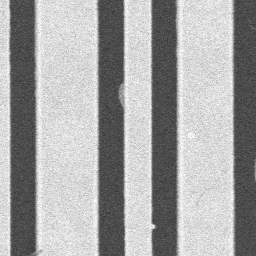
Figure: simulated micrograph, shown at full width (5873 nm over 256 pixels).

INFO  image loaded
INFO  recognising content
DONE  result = lines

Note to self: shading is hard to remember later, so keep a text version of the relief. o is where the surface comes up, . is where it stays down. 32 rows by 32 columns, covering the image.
o....ooooooo....ooo...ooooooo...
o....ooooooo....ooo...ooooooo...
o....ooooooo....ooo...ooooooo...
o....ooooooo....ooo...ooooooo...
o....ooooooo....ooo...ooooooo...
o....ooooooo....ooo...ooooooo...
o....ooooooo....ooo...ooooooo...
o....ooooooo....ooo...ooooooo...
o....ooooooo....ooo...ooooooo...
o....ooooooo....ooo...ooooooo...
o....ooooooo....ooo...ooooooo...
o....ooooooo....ooo...ooooooo...
o....ooooooo....ooo...ooooooo...
o....ooooooo....ooo...ooooooo...
o....ooooooo....ooo...ooooooo...
o....ooooooo....ooo...ooooooo...
o....ooooooo....ooo...ooooooo...
o....ooooooo....ooo...ooooooo...
o....ooooooo....ooo...ooooooo...
o....ooooooo....ooo...ooooooo...
o....ooooooo....ooo...ooooooo...
o....ooooooo....ooo...ooooooo...
o....ooooooo....ooo...ooooooo...
o....ooooooo....ooo...ooooooo...
o....ooooooo....ooo...ooooooo...
o....ooooooo....ooo...ooooooo...
o....ooooooo....ooo...ooooooo...
o....ooooooo....ooo...ooooooo...
o....ooooooo....ooo...ooooooo...
o....ooooooo....ooo...ooooooo...
o....ooooooo....ooo...ooooooo...
o...oooooooo....ooo...ooooooo...